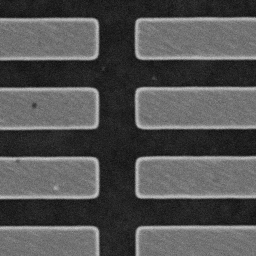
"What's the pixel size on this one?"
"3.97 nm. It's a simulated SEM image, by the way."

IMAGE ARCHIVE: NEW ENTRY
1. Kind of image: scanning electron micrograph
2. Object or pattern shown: groups of lines, slits or small figures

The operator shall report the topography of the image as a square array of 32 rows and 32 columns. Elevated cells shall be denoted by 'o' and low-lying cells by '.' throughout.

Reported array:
................................
................................
oooooooooooo.....ooooooooooooooo
oooooooooooo.....ooooooooooooooo
oooooooooooo.....ooooooooooooooo
oooooooooooo.....ooooooooooooooo
oooooooooooo.....ooooooooooooooo
................................
................................
................................
................................
oooooooooooo.....ooooooooooooooo
oooooooooooo.....ooooooooooooooo
oooooooooooo.....ooooooooooooooo
oooooooooooo.....ooooooooooooooo
oooooooooooo.....ooooooooooooooo
................................
................................
................................
................................
oooooooooooo.....ooooooooooooooo
oooooooooooo.....ooooooooooooooo
oooooooooooo.....ooooooooooooooo
oooooooooooo.....ooooooooooooooo
oooooooooooo.....ooooooooooooooo
................................
................................
................................
oooooooooooo......oooooooooooooo
oooooooooooo.....ooooooooooooooo
oooooooooooo.....ooooooooooooooo
oooooooooooo.....ooooooooooooooo